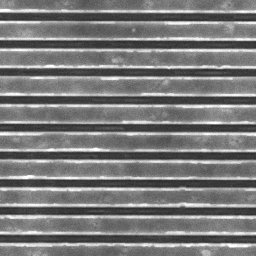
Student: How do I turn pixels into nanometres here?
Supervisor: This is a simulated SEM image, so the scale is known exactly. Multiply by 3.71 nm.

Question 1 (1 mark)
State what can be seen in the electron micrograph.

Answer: parallel lines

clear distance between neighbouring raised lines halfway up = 8.36 px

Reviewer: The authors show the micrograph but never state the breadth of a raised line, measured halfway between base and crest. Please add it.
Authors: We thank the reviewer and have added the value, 0.0718 um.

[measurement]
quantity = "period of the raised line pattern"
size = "103 nm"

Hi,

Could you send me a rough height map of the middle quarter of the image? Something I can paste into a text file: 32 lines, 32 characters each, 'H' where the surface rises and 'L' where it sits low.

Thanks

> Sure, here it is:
HHHHHHHHHHHHHHHHHHHHHHHHHHHHHHHH
LLLLLLLLLLLLLLLLLLLLLLLLLLLLLLLL
LLLLLLLLLLLLLLLLLLLLLLLLLLLLLLLL
HHHHHHHHHHHHHHHHHHHHHHHHHHHHHHHH
HHHHHHHHHHHHHHHHHHHHHHHHHHHHHHHH
HHHHHHHHHHHHHHHHHHHHHHHHHHHHHHHH
HHHHHHHHHHHHHHHHHHHHHHHHHHHHHHHH
HHHHHHHHHHHHHHHHHHHHHHHHHHHHHHHH
LLLLLLLLLLLLLLLLLLLLLLLLLLLLLLLL
LLLLLLLLLLLLLLLLLLLLLLLLLLLLLLLL
HHHHHHHHHHHHHHHHHHHHHHHHHHHHHHHH
HHHHHHHHHHHHHHHHHHHHHHHHHHHHHHHH
HHHHHHHHHHHHHHHHHHHHHHHHHHHHHHHH
HHHHHHHHHHHHHHHHHHHHHHHHHHHHHHHH
HHHHHHHHHHHHHHHHHHHHHHHHHHHHHHHH
LLLLLLLLLLLLLLLLLLLLLLLLLLLLLLLL
LLLLLLLLLLLLLLLLLLLLLLLLLLLLLLLL
HHHHHHHHHHHHHHHHHHHHHHHHHHHHHHHH
HHHHHHHHHHHHHHHHHHHHHHHHHHHHHHHH
HHHHHHHHHHHHHHHHHHHHHHHHHHHHHHHH
HHHHHHHHHHHHHHHHHHHHHHHHHHHHHHHH
HHHHHHHHHHHHHHHHHHHHHHHHHHHHHHHH
LLLLLLLLLLLLLLLLLLLLLLLLLLLLLLLL
LLLLLLLLLLLLLLLLLLLLLLLLLLLLLLLL
HHHHHHHHHHHHHHHHHHHHHHHHHHHHHHHH
HHHHHHHHHHHHHHHHHHHHHHHHHHHHHHHH
HHHHHHHHHHHHHHHHHHHHHHHHHHHHHHHH
HHHHHHHHHHHHHHHHHHHHHHHHHHHHHHHH
HHHHHHHHHHHHHHHHHHHHHHHHHHHHHHHH
LLLLLLLLLLLLLLLLLLLLLLLLLLLLLLLL
LLLLLLLLLLLLLLLLLLLLLLLLLLLLLLLL
HHHHHHHHHHHHHHHHHHHHHHHHHHHHHHHH